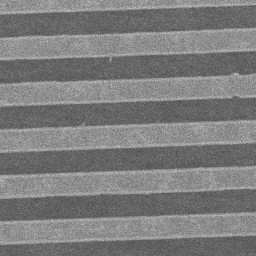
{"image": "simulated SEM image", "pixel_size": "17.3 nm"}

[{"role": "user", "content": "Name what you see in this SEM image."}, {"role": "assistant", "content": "parallel lines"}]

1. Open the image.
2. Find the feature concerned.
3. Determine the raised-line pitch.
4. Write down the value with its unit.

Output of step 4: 794 nanometres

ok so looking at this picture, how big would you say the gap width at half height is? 446 nm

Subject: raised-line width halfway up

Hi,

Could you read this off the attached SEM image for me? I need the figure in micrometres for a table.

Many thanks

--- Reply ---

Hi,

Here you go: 0.349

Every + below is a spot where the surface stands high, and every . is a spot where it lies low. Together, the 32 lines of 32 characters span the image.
+++++++++++++++++++++++++++++++.
++..............................
................................
................................
...........++.++++++++++++++++++
++++++++++++++++++++++++++++++++
+++++++++++++++++++++++++.......
................................
................................
.............................+.+
....++++++++++++++++++++++++++++
++++++++++++++++++++++++++++++++
++++++++++++++++................
................................
................................
........................++++++++
++++++++++++++++++++++++++++++++
++++++++++++++++++++++++++++++++
+++++++++.......................
................................
................................
..................++++++++++++++
++++++++++++++++++++++++++++++++
++++++++++++++++++++++++++++++..
+++.............................
................................
................................
...........+++++++++++++++++++++
++++++++++++++++++++++++++++++++
+++++++++++++++++++++++.........
................................
................................